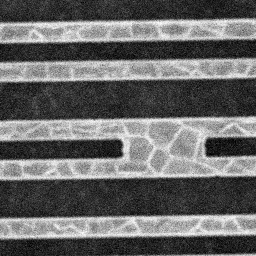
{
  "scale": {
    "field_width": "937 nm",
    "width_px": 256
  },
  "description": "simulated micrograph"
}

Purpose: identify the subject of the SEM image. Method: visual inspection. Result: parallel lines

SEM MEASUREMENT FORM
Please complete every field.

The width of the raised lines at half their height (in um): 0.0608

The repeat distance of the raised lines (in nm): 178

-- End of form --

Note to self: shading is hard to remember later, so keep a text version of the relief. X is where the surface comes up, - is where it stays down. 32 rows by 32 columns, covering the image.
--------------------------------
--------------------------------
--------------------------------
XXXXXXXXXXXXXXXXXXXXXXXXXXXXXXXX
XXXXXXXXXXXXXXXXXXXXXXXXXXXXXXXX
--------------------------------
--------------------------------
--------------------------------
XXXXXXXXXXXXXXXXXXXXXXXXXXXXXXXX
XXXXXXXXXXXXXXXXXXXXXXXXXXXXXXXX
--------------------------------
--------------------------------
--------------------------------
--------------------------------
--------------------------------
XXXXXXXXXXXXXXXXXXXXXXXXXXXXXXXX
XXXXXXXXXXXXXXXXXXXXXXXXXXXXXXXX
---------------XXXXXXXXXX-------
----------------XXXXXXXXX-------
----------------XXXXXXXXXX------
XXXXXXXXXXXXXXXXXXXXXXXXXXXXXXXX
XXXXXXXXXXXXXXXXXXXXXXXXXXXXXXXX
--------------------------------
--------------------------------
--------------------------------
--------------------------------
--------------------------------
----XXXXXXXXXXXXXXXXXXXXXXXXXXXX
XXXXXXXXXXXXXXXXXXXXXXXXXXXXXXXX
XX------------------------------
--------------------------------
--------------------------------